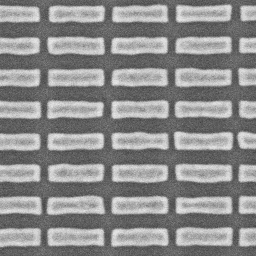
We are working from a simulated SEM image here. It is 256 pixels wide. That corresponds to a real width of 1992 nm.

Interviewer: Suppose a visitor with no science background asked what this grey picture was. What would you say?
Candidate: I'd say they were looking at wiring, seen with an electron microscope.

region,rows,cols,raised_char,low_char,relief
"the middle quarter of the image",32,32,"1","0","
00000000000000000000000000000000
00000000000000000000000000000000
11111111100001111111111110001111
11111111100001111111111110001111
11111111100001111111111110001111
00000000000000000000000000000000
00000000000000000000000000000000
00000000000000000000000000000000
00000000000000000000000000000000
00000000000000000000000000000000
11111111100011111111111111001111
11111111100011111111111111001111
11111111100011111111111111001111
00000000000000000000000000000000
00000000000000000000000000000000
00000000000000000000000000000000
00000000000000000000000000000000
00000000000000000000000000000000
11111111100011111111111110001111
11111111100001111111111111001111
11111111100001111111111110001111
00000000000000000000000000000000
00000000000000000000000000000000
00000000000000000000000000000000
00000000000000000000000000000000
00000000000000000000000000000000
11111111100001111111111110001111
11111111100001111111111110001111
11111111100001111111111110000111
00000000000000000000000000000000
00000000000000000000000000000000
00000000000000000000000000000000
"